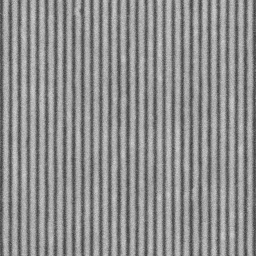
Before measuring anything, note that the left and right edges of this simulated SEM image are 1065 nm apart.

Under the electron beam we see parallel lines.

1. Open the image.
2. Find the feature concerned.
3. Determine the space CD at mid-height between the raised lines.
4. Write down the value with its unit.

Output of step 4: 0.0182 um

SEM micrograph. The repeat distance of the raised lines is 37.6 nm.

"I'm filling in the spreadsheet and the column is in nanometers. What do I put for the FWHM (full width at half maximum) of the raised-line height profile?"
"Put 18.7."